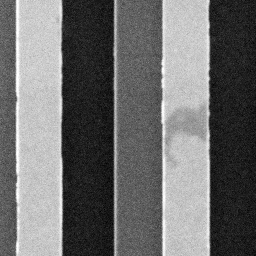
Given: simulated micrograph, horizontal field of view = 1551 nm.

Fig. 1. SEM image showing lines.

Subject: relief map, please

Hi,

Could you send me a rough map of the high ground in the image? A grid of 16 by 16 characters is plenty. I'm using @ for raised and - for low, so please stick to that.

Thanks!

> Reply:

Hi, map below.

@@@@---@@@@@@---
@@@@---@@@@@@---
@@@@---@@@@@@---
@@@@---@@@@@@---
@@@@---@@@@@@---
@@@@---@@@@@@---
@@@@---@@@@@@---
@@@@---@@@@@@---
@@@@---@@@@@@---
@@@@---@@@@@@---
@@@@---@@@@@@---
@@@@---@@@@@@---
@@@@---@@@@@@---
@@@@---@@@@@@---
@@@@---@@@@@@---
@@@@---@@@@@@---